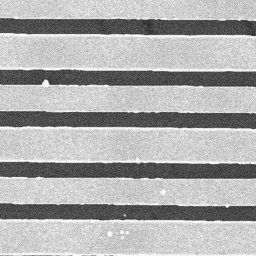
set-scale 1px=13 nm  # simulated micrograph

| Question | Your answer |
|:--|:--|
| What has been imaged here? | lines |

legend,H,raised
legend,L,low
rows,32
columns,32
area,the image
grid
HHHHHHHHHHHHHHHHHHHHHHHHHHHHHHHH
HHHHHHHHHHHHHHHHHHHHHHHHHHHHHHHH
LLLLLLLLLLLLLLLLLLLLLLLLLLLLLLLL
LLLLLLLLLLLLLLLLLLLLLLLLLLLLLLLL
HHHHHHHHHHHHHHHHHLLLLLLLLLLLLLLL
HHHHHHHHHHHHHHHHHHHHHHHHHHHHHHHH
HHHHHHHHHHHHHHHHHHHHHHHHHHHHHHHH
HHHHHHHHHHHHHHHHHHHHHHHHHHHHHHHH
HHHHHHHHHHHHHHHHHHHHHHHHHHHHHHHH
LLLLLLLLLLLLLLLLLLLLLLLLLLLLLLLL
LLLLLHLLLLLLLLLLLLLLLLLLLLLLLLLL
HHHHHHHHHHHHHHHHHHHHHHHHHHHHHHHH
HHHHHHHHHHHHHHHHHHHHHHHHHHHHHHHH
HHHHHHHHHHHHHHHHHHHHHHHHHHHHHHHH
LLLLLLLLLLLLLLLLLLLLLLLLLLLLLLLL
LLLLLLLLLLLLLLLLLLLLLLLLLLLLLLLL
HHHHHHHHHHHHHHHHHHHHHHHHHHHHHHHH
HHHHHHHHHHHHHHHHHHHHHHHHHHHHHHHH
HHHHHHHHHHHHHHHHHHHHHHHHHHHHHHHH
HHHHHHHHHHHHHHHHHHHHHHHHHHHHHHHH
LLLLLLLLLLLLLLLLLLLLLLLLLLLLLLLL
LLLLLLLLLLLLLLLLLLLLLLLLLLLLLLLL
HHHHHHHHHHHHHHHHHHHHHHHHHHHHHHHH
HHHHHHHHHHHHHHHHHHHHHHHHHHHHHHHH
HHHHHHHHHHHHHHHHHHHHHHHHHHHHHHHH
LLLLLLLLLLHLLLHHHHHHHHHHHHHHHHHH
LLLLLLLLLLLLLLLLLLLLLLLLLLLLLLLL
LLLLLLLLLLLLLLLLLLLLLLLLLLLLLLLL
HHHHHHHHHHHHHHHHHHHHHHHHHHHHHHHH
HHHHHHHHHHHHHHHHHHHHHHHHHHHHHHHH
HHHHHHHHHHHHHHHHHHHHHHHHHHHHHHHH
HHHHHHHHHHHHHHHHHHHHHHHHHHHHHHHH